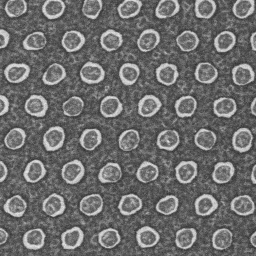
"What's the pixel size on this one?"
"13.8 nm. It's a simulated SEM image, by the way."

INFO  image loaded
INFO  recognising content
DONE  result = a regular array of raised bodies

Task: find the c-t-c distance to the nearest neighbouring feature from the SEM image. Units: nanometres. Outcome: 508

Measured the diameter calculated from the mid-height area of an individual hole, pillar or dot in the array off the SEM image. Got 269 nanometers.